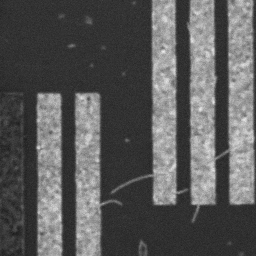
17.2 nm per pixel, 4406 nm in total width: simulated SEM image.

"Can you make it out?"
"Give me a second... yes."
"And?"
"wiring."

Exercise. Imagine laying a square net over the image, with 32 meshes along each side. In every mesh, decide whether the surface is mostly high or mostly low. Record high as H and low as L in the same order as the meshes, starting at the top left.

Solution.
LLLLLLLLLLLLLLLLLLLHHHLLHHHLLHHH
LLLLLLLLLLLLLLLLLLLHHHLLHHHLLHHL
LLLLLLLLLLLLLLLLLLLHHHLLHHHLLHHL
LLLLLLLLLLLLLLLLLLLHHHLLHHHLLHHH
LLLLLLLLLLLLLLLLLLLHHHLLHHHLLHHH
LLLLLLLLLLLLLLLLLLLHHHLLHHHLLHHH
LLLLLLLLLLLLLLLLLLLHHHLLHHHLLHHH
LLLLLLLLLLLLLLLLLLLHHHLLHHHLLHHH
LLLLLLLLLLLLLLLLLLLHHHLLHHHLLHHH
LLLLLLLLLLLLLLLLLLLHHHLLHHHLLHHH
LLLLLLLLLLLLLLLLLLLHHHLLHHHLLHHH
LLLLLLLLLLLLLLLLLLLHHHLLHHHLLHHH
HHHLLHHHLLHHLLLLLLLHHHLLHHHLLHHH
HHHLLHHHLLHHLLLLLLLHHHLLHHHLLHHH
HHHLLHHHLLHHLLLLLLLHHHLLHHHLLHHH
HHHLLHHHLLHHLLLLLLLHHHLLHHHLLHHH
HHHLLHHHLLHHLLLLLLLHHHLLHHHLLHHH
HHHLLHHHLLHHLLLLLLLHHHLLHHHLLHHH
HHHLLHHHLLHHLLLLLLLHHHLLHHHLLHHH
HHHLLHHHLLHHLLLLLLLHHHLLHHHLLHHH
HHHLLHHHLLHHLLLLLLLHHHLLHHHLLHHH
HHHLLHHHLLHHLLLLLLLHHHLLHHHLLHHH
HHHLLHHHLLHHLLLLLLLHHHLLHHHLLHHH
HHHLLHHHLLHHLLLLLLLHHHLLHHHLLHHH
HHHLLHHHLLHHLLLLLLLHHHLLHHHLLHHH
HHHLLHHHLLHHLLLLLLLLLLLLHLLLLLLL
HHHLLHHHLLHHLLLLLLLLLLLLLLLLLLLL
HHHLLHHHLLHHLLLLLLLLLLLLLLLLLLLL
HHHLLHHHLLHHLLLLLLLLLLLLLLLLLLLL
HHHLLHHHLLHHLLLLLLLLLLLLLLLLLLLL
HHHLLHHHLLHHLLLLLLLLLLLLLLLLLLLL
HHHLLHHHLLHHLLLLLHLLLLLLLLLLLLLL